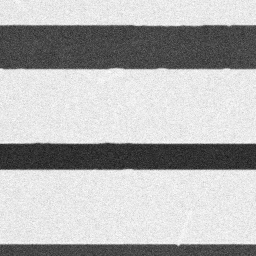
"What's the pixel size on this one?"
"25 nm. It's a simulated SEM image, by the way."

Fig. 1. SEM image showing lines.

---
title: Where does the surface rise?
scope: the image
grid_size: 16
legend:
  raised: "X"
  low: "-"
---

XXXXXXXXXXXXXXXX
XXXXXXXXXXXXXXXX
----------------
----------------
XXXXXXXXXXXXXXXX
XXXXXXXXXXXXXXXX
XXXXXXXXXXXXXXXX
XXXXXXXXXXXXXXXX
XXXXXXXXXXXXXXXX
----------------
----------------
XXXXXXXXXXXXXXXX
XXXXXXXXXXXXXXXX
XXXXXXXXXXXXXXXX
XXXXXXXXXXXXXXXX
----------------